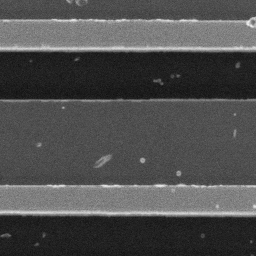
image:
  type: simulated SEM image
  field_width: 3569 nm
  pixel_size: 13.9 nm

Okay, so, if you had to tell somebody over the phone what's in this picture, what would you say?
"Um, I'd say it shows lines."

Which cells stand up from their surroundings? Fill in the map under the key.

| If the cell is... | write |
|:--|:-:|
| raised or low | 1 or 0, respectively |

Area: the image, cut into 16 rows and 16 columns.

1111111111111111
1111111111111111
1111111111111111
0000000000000000
0000000000000000
0000000000000000
1111111111111111
1111111111111111
1111111111111111
1111111111111111
1111111111111111
1111111111111111
1111111111111111
0000000000000000
0000000000000000
0000000000000000